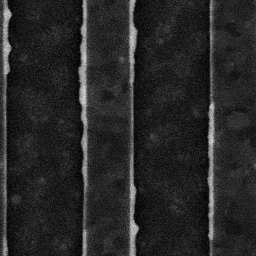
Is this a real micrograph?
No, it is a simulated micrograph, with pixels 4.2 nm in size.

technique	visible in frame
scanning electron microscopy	one or a few lines or trenches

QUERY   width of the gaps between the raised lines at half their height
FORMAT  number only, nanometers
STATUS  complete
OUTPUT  317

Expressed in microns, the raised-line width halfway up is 0.218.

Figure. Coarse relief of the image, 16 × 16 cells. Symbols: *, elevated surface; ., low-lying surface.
*....***.....***
*....***.....***
*....****....***
*....***.....***
*....***.....***
.....***.....***
.....***.....***
.....***.....***
.....***.....***
.....***.....***
.....***.....***
.....***.....***
.....***.....***
.....***.....***
.....****....***
.....***.....***